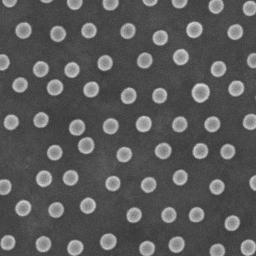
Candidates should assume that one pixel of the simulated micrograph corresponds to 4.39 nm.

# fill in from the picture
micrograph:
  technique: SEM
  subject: a regular array of raised bodies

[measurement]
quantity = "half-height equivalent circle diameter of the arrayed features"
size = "65.2 nm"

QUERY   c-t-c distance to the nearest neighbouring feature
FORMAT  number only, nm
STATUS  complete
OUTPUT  134